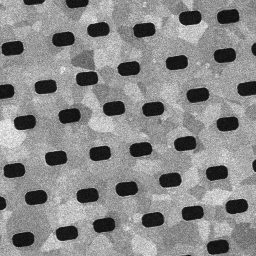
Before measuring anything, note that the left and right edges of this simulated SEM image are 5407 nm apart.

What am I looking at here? a regular array of holes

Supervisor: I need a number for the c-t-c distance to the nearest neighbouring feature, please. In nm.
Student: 831